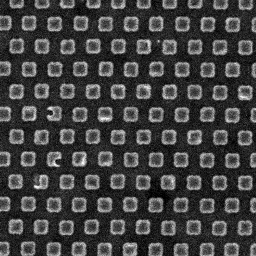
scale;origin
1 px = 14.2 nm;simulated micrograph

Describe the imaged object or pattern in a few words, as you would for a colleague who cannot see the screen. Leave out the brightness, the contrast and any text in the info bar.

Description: a regular array of raised bodies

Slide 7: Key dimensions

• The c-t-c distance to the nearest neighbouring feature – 359 nm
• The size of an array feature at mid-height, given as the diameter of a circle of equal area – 208 nm